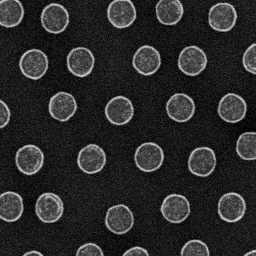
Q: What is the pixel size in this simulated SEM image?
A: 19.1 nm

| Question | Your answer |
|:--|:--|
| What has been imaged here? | a regular array of raised bodies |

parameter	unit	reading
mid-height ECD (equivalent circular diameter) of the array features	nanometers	525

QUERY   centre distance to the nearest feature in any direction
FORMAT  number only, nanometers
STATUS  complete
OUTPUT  1010